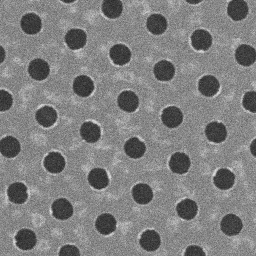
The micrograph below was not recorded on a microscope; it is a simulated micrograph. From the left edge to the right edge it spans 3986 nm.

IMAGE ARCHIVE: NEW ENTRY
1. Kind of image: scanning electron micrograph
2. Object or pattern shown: a regular array of holes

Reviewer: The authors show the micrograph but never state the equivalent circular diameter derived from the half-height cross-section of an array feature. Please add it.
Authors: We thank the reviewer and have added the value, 350 nanometres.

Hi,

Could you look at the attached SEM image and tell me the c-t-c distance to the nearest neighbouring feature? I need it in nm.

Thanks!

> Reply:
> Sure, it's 725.